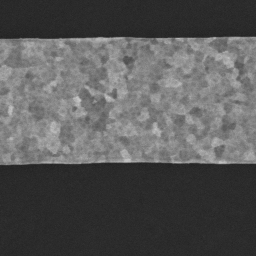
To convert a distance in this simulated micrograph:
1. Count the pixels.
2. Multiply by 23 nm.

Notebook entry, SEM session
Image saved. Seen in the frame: wiring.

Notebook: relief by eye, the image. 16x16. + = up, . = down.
................
................
++++++++++++++++
++++++++++++++++
++++++++++++++++
++++++++++++++++
++++++++++++++++
++++++++++++++++
++++++++++++++++
++++++++++++++++
................
................
................
................
................
................